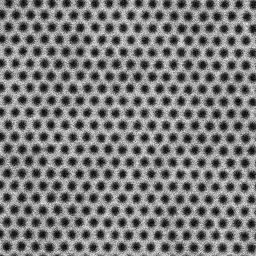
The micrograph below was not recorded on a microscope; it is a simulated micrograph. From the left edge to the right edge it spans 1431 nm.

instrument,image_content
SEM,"a regular array of holes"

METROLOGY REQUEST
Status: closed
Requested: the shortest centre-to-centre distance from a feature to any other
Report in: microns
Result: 0.077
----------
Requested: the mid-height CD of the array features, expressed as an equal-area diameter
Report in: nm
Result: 52